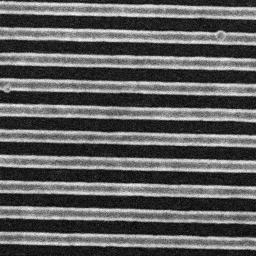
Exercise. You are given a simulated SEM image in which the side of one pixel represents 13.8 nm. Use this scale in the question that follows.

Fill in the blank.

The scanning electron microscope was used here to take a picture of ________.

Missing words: parallel lines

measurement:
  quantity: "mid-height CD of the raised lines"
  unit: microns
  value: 0.133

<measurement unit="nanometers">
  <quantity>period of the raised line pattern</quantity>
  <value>354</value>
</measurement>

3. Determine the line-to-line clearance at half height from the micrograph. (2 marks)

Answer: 218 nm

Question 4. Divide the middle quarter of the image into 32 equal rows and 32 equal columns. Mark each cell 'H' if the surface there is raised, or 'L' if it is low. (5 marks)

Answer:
LLLLLLLLLLHHHHHHHHHHHHHHHHHHHHHH
LLLLLLLLLLLLLLLLLLLLLLLLLLLLLLLL
LLLLLLLLLLLLLLLLLLLLLLLLLLLLLLLL
LLLLLLLLLLLLLLLLLLLLLLLLLLLLLLLL
HHHLLLLLLLLLLLLLLLLLLLLLLLLLLLLL
HHHHHHHHHHHHHHHHHHHHHHHHHHHHHHHH
HHHHHHHHHHHHHHHHHHHHHHHHHHHHHHHH
LLLLLLLLLLLLLLLLLLLLLLLLLLLLLLLL
LLLLLLLLLLLLLLLLLLLLLLLLLLLLLLLL
LLLLLLLLLLLLLLLLLLLLLLLLLLLLLLLL
LLLLLLLLLLLLLLLLLLLLLLLLLLLLLLLL
HHHHHHHHHHHHHHHHHHHHHHHHHHHHHHHL
HHHHHHHHHHHHHHHHHHHHHHHHHHHHHHHH
LLLLLLLLLLLLLLHHLLLLLLLLHHHHHHHH
LLLLLLLLLLLLLLLLLLLLLLLLLLLLLLLL
LLLLLLLLLLLLLLLLLLLLLLLLLLLLLLLL
LLLLLLLLLLLLLLLLLLLLLLLLLLLLLLLL
HHHHHHHHHHLLHHHHHLLLLLLLLLLLLLLL
HHHHHHHHHHHHHHHHHHHHHHHHHHHHHHHH
LLLLLLLLLHHHHHHHHHHHHHHHHHHHHHHH
LLLLLLLLLLLLLLLLLLLLLLLLLLLLLLLL
LLLLLLLLLLLLLLLLLLLLLLLLLLLLLLLL
LLLLLLLLLLLLLLLLLLLLLLLLLLLLLLLL
LLLLLLLLLLLLLLLLLLLLLLLLLLLLLLLL
HHHHHHHHHHHHHHHHHHHHHHHHHHHHHHHH
HHHHHHHHHHHHHHHHHHHHHHHHHHHHHHHH
LLLLLLLLLLLLLLLLLLLLLLLLLLLLLHHH
LLLLLLLLLLLLLLLLLLLLLLLLLLLLLLLL
LLLLLLLLLLLLLLLLLLLLLLLLLLLLLLLL
LLLLLLLLLLLLLLLLLLLLLLLLLLLLLLLL
HHHHHHHHHHHHHHHHHHHHHHHHLLLLLHHL
HHHHHHHHHHHHHHHHHHHHHHHHHHHHHHHH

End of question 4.